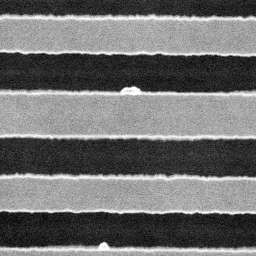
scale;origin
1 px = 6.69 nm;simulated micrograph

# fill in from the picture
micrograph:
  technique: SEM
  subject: lines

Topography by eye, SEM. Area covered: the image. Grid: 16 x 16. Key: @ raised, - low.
----------------
@@@@@@@@@@@@@@@@
@@@@@@@@@@@@@@@@
----------------
----------------
----------------
@@@@@@@@@@@@@@@@
@@@@@@@@@@@@@@@@
@@@@@@@@@@@@@@@@
----------------
----------------
@@@@@@@@@@@@@@@@
@@@@@@@@@@@@@@@@
----------------
----------------
------@---------